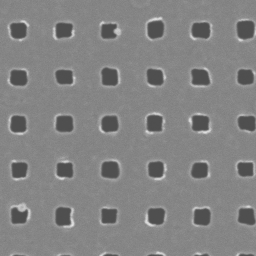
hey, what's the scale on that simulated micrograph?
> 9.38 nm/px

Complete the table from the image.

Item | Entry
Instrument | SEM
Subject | a regular array of holes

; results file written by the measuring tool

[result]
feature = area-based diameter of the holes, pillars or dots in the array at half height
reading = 165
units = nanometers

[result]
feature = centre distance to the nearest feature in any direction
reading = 422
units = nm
